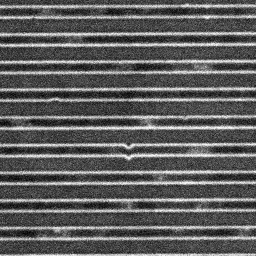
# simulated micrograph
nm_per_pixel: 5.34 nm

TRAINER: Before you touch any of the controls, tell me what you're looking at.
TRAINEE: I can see parallel lines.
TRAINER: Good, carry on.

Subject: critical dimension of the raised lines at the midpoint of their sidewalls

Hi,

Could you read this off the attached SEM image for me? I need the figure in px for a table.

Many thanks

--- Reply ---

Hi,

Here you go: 11.8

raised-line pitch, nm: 148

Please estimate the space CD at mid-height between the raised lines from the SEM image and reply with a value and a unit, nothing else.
83.5 nanometers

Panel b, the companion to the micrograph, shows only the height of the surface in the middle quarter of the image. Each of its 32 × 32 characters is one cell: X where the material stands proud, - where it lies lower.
XXXXXXXXXXXXXXXXXXXXXXXXXXXXXXXX
XXXXXXXXXXXXXXXXXXXXXXXXXXXXXXXX
--------------------------------
--------------------------------
--------------------------------
--------------------------------
XXXXXXXXXXXXXXXXXXXXXXXXXXXXXXXX
XXXXXXXXXXXXXXXXXXXXXXXXXXXXXXXX
XXXXXXXXXXXXXXXXXXXXXXXXXXXXXXXX
--------------------------------
--------------------------------
--------------------------------
--------------------------------
XXXXXXXXXXXXXXXXXXXXXXXXXXXXXXXX
XXXXXXXXXXXXXXXXXXXXXXXXXXXXXXXX
XXXXXXXXXXXXXXXXXXXXXXXXXXXXXXXX
--------------------------------
--------------------------------
--------------------------------
--------------------------------
XXXXXXXXXXXXXXXX-XXXXXXXXXXXXXXX
XXXXXXXXXXXXXXXXXXXXXXXXXXXXXXXX
XXXXXXXXXXXXXXXXXXXXXXXXXXXXXXXX
---------------XX---------------
--------------------------------
--------------------------------
--------------------------------
XXXXXXXXXXXXXXXXXXXXXXXXXXXXXXXX
XXXXXXXXXXXXXXXXXXXXXXXXXXXXXXXX
XXXXXXXXXXXXXXXXXXXXXXXXXXXXXXXX
--------------------------------
--------------------------------